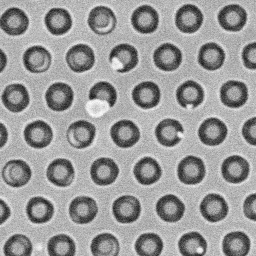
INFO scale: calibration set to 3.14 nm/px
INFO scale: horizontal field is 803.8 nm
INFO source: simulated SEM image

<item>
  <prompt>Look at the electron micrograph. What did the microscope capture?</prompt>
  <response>an array of small figures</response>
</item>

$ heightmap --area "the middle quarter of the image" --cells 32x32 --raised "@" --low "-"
@------@@@@@@@@---@@@@@------@@@
@@-----@@@@@@----@@@@@@@----@@@@
@@@@@@@@@@@@@@@@@@@@@@@@@@@@@@@@
@@@@@@@@@@@@@@@@@@@@@@@@@@@@@@@@
@@@@@@@@---@@@@@@@@@--@@@@@@@@--
--@@@@@-----@@@@@@------@@@@@---
--@@@@-------@@@@-------@@@@----
---@@@-------@@@@-------@@@@----
---@@@-------@@@@-------@@@@----
--@@@@@@@@@--@@@@-------@@@@----
--@@@@@@@@@-@@@@@@-----@@@@@@--@
-@@@@@@@@@@@@@@@@@@@-@@@@@@@@@@@
@@@@@@@@@@@@@@@@@@@@@@@@@@@@@@@@
@@@@@@@@@@@@@@@@@@@@@@@@@@@@@@@@
@@----@@@@@@@----@@@@@@@-----@@@
@-------@@@@------@@@@@-------@@
@@------@@@--------@@@@-------@@
@@------@@@--------@@@@-----@@@@
@@@-----@@@@-------@@@@------@@@
@@@-----@@@@------@@@@@------@@@
@@-----@@@@@@----@@@@@@@@---@@@@
@@@@@@@@@@@@@@@@@@@@@@@@@@@@@@@@
@@@@@@@@@@@@@@@@@@@@@@@@@@@@@@@@
@@@@@@@@@--@@@@@@@@---@@@@@@@@--
--@@@@@------@@@@@------@@@@@---
--@@@@@------@@@@-------@@@@----
---@@@--------@@@-------@@@@----
---@@@--------@@@--------@@@----
-@-@@@@------@@@@@------@@@@----
--@@@@@------@@@@@-----@@@@@@---
-@@@@@@@@--@@@@@@@@@-@@@@@@@@@@@
@@@@@@@@@@@@@@@@@@@@@@@@@@@@@@@@